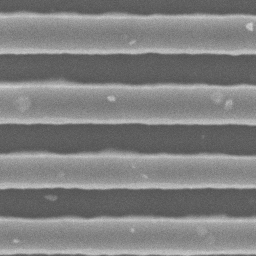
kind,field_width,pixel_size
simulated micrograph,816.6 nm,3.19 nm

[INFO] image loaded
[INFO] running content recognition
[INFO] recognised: lines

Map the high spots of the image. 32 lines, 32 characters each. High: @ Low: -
--------------------------------
--------------------------------
@@@@@@@@@@@@@@@@@@@@@@@@@@@@@@@@
@@@@@@@@@@@@@@@@@@@@@@@@@@@@@@@@
@@@@@@@@@@@@@@@@@@@@@@@@@@@@@@@@
@@@@@@@@@@@@@@@@@@@@@@@@@@@@@@@@
@@@@@@@@@@@@@@@@@@@@@@@@@@@@@@@@
--------------------------------
--------------------------------
--------------------------------
--------------------------------
@@@@@@@@@@@@@@@@@@@@@@@@@@@@@@@@
@@@@@@@@@@@@@@@@@@@@@@@@@@@@@@@@
@@@@@@@@@@@@@@@@@@@@@@@@@@@@@@@@
@@@@@@@@@@@@@@@@@@@@@@@@@@@@@@@@
-------------------------------@
--------------------------------
--------------------------------
--------------------------------
@@@@@@@@-@@@@@@@@---@-----------
@@@@@@@@@@@@@@@@@@@@@@@@@@@@@@@@
@@@@@@@@@@@@@@@@@@@@@@@@@@@@@@@@
@@@@@@@@@@@@@@@@@@@@@@@@@@@@@@@@
@-@@------@@@@--@@@-@@@@------@-
--------------------------------
--------------------------------
--------------------------------
@@@----@@@-@@@@@@@@@@-----@@----
@@@@@@@@@@@@@@@@@@@@@@@@@@@@@@@@
@@@@@@@@@@@@@@@@@@@@@@@@@@@@@@@@
@@@@@@@@@@@@@@@@@@@@@@@@@@@@@@@@
@@@@@@@@@@@@@@@@@@@@@@@@@@@@@@@@